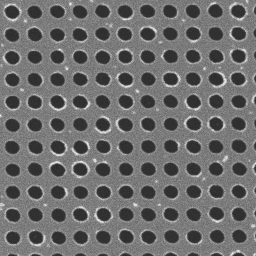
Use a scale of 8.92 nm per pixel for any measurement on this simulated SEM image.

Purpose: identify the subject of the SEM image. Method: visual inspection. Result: a regular array of holes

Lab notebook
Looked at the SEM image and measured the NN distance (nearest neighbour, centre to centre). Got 198 nm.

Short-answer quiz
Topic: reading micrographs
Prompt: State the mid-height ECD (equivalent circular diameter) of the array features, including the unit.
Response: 124 nanometres